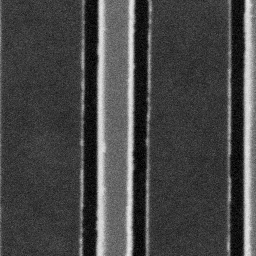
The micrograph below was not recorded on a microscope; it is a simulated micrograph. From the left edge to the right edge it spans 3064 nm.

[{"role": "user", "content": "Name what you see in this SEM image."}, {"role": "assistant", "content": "lines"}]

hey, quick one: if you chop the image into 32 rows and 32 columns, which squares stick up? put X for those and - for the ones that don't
XXXXXXXXXX--XXXXX--XXXXXXXXXX--X
XXXXXXXXXX--XXXXX--XXXXXXXXXX--X
XXXXXXXXXX--XXXXX--XXXXXXXXXX--X
XXXXXXXXXX--XXXXX--XXXXXXXXXX--X
XXXXXXXXXX--XXXXX--XXXXXXXXXX--X
XXXXXXXXXX--XXXXX--XXXXXXXXXX--X
XXXXXXXXXX--XXXXX--XXXXXXXXXX--X
XXXXXXXXXX--XXXXX--XXXXXXXXXX--X
XXXXXXXXXX--XXXXX--XXXXXXXXXX--X
XXXXXXXXXX--XXXXX--XXXXXXXXXX--X
XXXXXXXXXX--XXXX---XXXXXXXXXX--X
XXXXXXXXXX--XXXX---XXXXXXXXXX--X
XXXXXXXXXX--XXXX---XXXXXXXXXX--X
XXXXXXXXXX--XXXX---XXXXXXXXXX--X
XXXXXXXXXX--XXXX--XXXXXXXXXXX--X
XXXXXXXXXX--XXXX--XXXXXXXXXXX--X
XXXXXXXXXX--XXXX--XXXXXXXXXXX--X
XXXXXXXXXX--XXXX--XXXXXXXXXXX--X
XXXXXXXXXX--XXXX--XXXXXXXXXXX--X
XXXXXXXXXX--XXXX--XXXXXXXXXXX--X
XXXXXXXXXX--XXXX--XXXXXXXXXXX--X
XXXXXXXXXX--XXXX--XXXXXXXXXXX--X
XXXXXXXXXX--XXXX--XXXXXXXXXXX--X
XXXXXXXXXX--XXXX--XXXXXXXXXXX--X
XXXXXXXXXX--XXXX--XXXXXXXXXXX--X
XXXXXXXXXX--XXXX--XXXXXXXXXXX--X
XXXXXXXXXX--XXXX--XXXXXXXXXXX--X
XXXXXXXXXX--XXXX--XXXXXXXXXXX--X
XXXXXXXXXX--XXXX--XXXXXXXXXXX--X
XXXXXXXXXX--XXXX--XXXXXXXXXXX--X
XXXXXXXXXX--XXXX--XXXXXXXXXXX--X
XXXXXXXXXX--XXXX--XXXXXXXXXXX--X